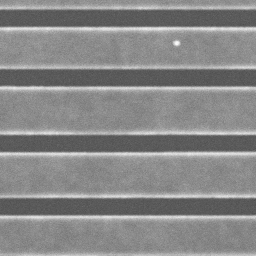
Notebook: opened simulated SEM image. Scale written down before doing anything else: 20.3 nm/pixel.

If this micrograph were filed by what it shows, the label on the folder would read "lines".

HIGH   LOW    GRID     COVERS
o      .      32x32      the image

oooooooooooooooooooooooooooooooo
................................
................................
oooooooooooooooooooooooooooooooo
oooooooooooooooooooooooooooooooo
oooooooooooooooooooooooooooooooo
oooooooooooooooooooooooooooooooo
oooooooooooooooooooooooooooooooo
oooooooooooooooooooooooooooooooo
................................
................................
oooooooooooooooooooooooooooooooo
oooooooooooooooooooooooooooooooo
oooooooooooooooooooooooooooooooo
oooooooooooooooooooooooooooooooo
oooooooooooooooooooooooooooooooo
oooooooooooooooooooooooooooooooo
................................
................................
oooooooooooooooooooooooooooooooo
oooooooooooooooooooooooooooooooo
oooooooooooooooooooooooooooooooo
oooooooooooooooooooooooooooooooo
oooooooooooooooooooooooooooooooo
oooooooooooooooooooooooooooooooo
................................
................................
oooooooooooooooooooooooooooooooo
oooooooooooooooooooooooooooooooo
oooooooooooooooooooooooooooooooo
oooooooooooooooooooooooooooooooo
oooooooooooooooooooooooooooooooo